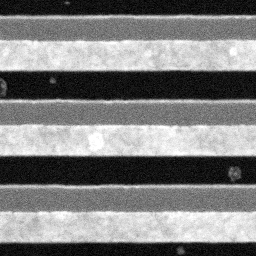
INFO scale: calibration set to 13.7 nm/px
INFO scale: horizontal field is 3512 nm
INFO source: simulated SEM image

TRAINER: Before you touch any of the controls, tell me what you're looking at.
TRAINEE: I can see lines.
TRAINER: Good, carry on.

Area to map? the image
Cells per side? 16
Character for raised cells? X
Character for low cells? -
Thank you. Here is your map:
----------------
XXXXXXXXXXXXXXXX
XXXXXXXXXXXXXXXX
XXXXXXXXXXXXXXXX
----------------
----------------
XXXXXXXXXXXXXXXX
XXXXXXXXXXXXXXXX
XXXXXXXXXXXXXXXX
XXXXXXXXXXXXXXXX
----------------
----------------
XXXXXXXXXXXXXXXX
XXXXXXXXXXXXXXXX
XXXXXXXXXXXXXXXX
----------------